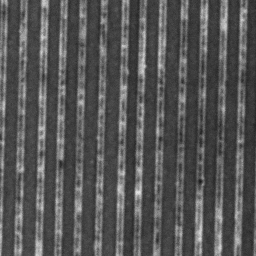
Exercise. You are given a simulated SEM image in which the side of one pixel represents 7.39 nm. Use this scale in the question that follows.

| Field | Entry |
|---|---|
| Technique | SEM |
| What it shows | parallel lines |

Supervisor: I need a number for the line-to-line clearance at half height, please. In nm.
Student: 109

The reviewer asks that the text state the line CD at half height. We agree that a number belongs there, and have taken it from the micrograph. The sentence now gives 36.9 nanometers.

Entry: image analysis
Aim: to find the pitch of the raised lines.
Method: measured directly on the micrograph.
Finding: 148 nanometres